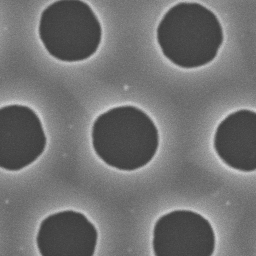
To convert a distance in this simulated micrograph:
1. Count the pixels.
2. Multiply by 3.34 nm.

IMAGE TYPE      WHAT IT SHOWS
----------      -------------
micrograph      holes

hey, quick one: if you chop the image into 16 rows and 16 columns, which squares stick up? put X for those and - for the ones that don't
XXX---XXXXX--XXX
XX----XXXX----XX
XXX---XXXX----XX
XXX---XXXX---XXX
XXXXXXXXXXXXXXXX
XXXXXXXXXXXXXXXX
XXXXXXXXXXXXXXXX
--XXXX---XXXXX--
---XXX----XXX---
---XXX----XXXX--
-XXXXXX--XXXXXX-
XXXXXXXXXXXXXXXX
XXXXXXXXXXXXXXXX
XXX--XXXXX---XXX
XX----XXXX---XXX
XX----XXXX---XXX